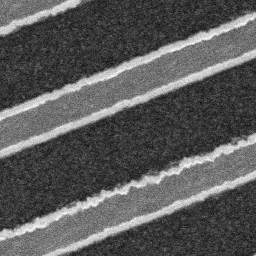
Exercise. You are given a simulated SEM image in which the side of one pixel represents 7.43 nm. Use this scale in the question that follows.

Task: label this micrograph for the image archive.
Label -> one or a few lines or trenches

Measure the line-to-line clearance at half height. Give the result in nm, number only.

575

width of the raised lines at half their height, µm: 0.265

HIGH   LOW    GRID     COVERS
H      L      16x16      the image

HHHHLLLLLLLLLLLL
HLLLLLLLLLLLLLLH
LLLLLLLLLLLLHHHH
LLLLLLLLLHHHHHHH
LLLLLLLHHHHHHLLL
LLLLHHHHHHHLLLLL
LLHHHHHHLLLLLLLL
HHHHHHLLLLLLLLLL
HHHLLLLLLLLLLLLL
LLLLLLLLLLLLLLHH
LLLLLLLLLLLHHHHH
LLLLLLLLHHHHHHHL
LLLLLLHHHHHHLLLL
LLLHHHHHHHLLLLLL
LHHHHHHLLLLLLLLL
HHHHLLLLLLLLLLLL